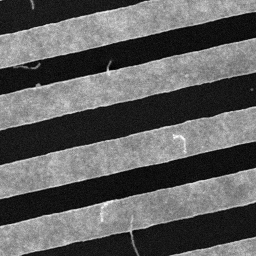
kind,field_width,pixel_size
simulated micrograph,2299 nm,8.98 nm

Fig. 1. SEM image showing lines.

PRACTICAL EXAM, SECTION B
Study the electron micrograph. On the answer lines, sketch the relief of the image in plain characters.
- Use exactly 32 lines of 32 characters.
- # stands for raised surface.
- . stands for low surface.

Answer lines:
.................###############
.............###################
........###################.....
....##################..........
##################..............
##############..............####
#########...............########
#####...............############
...............#################
...........###################..
......###################.......
..###################...........
#################...............
############...................#
########...................#####
###...................##########
..................##############
..............##################
.........###################....
.....###################........
.##################.............
###############...............##
##########...............#######
######...............###########
##..............################
............###################.
........###################.....
....##################..........
##################..............
#############...................
#########...................####
####...................#########